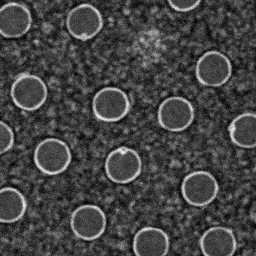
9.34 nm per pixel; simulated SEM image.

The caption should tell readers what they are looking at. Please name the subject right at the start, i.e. a regular array of raised bodies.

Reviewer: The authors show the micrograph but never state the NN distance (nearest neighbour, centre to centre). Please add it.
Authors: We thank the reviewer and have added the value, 625 nm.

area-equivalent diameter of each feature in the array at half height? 315 nm